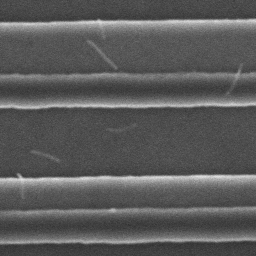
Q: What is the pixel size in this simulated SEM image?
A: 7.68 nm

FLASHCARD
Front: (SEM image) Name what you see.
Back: lines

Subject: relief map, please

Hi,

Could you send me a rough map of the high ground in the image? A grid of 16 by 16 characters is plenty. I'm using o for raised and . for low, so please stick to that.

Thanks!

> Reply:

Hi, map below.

................
oooooooooooooooo
oooooooooooooooo
oooooooooooooooo
oooooooooooooooo
oooooooooooooooo
oooooooooooooooo
................
................
................
................
oooooooooooooooo
oooooooooooooooo
oooooooooooooooo
oooooooooooooooo
................